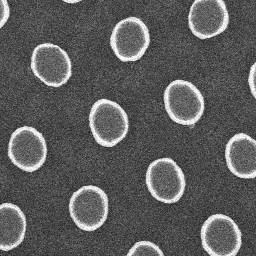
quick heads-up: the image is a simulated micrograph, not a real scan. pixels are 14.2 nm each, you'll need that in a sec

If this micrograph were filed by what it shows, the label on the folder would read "raised bodies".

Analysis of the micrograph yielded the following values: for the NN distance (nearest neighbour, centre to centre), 1150 nanometers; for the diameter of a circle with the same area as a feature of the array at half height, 552 nanometres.